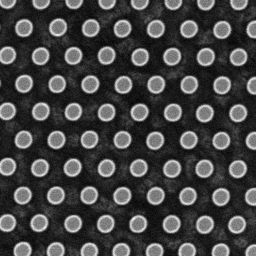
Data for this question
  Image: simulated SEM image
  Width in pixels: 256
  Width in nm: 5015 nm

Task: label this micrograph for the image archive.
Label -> a regular array of raised bodies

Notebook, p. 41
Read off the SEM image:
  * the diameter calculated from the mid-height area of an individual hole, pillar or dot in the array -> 332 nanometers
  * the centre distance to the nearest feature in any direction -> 624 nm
